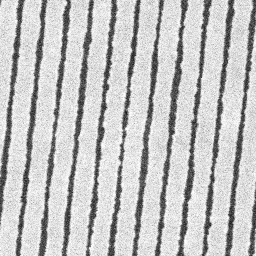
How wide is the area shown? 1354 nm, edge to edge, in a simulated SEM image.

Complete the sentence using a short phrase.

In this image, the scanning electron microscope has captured parallel lines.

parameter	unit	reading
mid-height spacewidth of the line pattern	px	5.71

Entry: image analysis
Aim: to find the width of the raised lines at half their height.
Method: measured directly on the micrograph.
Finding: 90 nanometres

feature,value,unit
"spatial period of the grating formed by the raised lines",122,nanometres